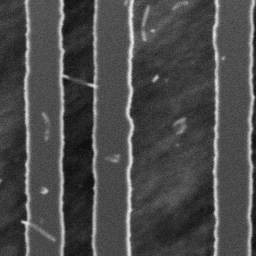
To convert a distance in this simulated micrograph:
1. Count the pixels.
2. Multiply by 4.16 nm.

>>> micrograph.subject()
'lines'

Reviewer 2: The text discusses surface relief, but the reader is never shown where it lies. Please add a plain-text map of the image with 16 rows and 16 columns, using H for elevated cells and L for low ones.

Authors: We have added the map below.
LLHHLLHHLLLLLHHH
LLHHLLHHLLLLLHHH
LLHHLLHHLLLLLHHH
LLHHLLHHLLLLLHHH
LLHHLLHHLLLLLHHH
LLHHLLHHLLLLLHHH
LLHHLLHHLLLLLHHH
LLHHLLHHLLLLLHHH
LLHHLLHHLLLLLHHH
LLHHLLHHLLLLLHHH
LLHHLLHHLLLLLHHH
LLHHLLHHLLLLLHHH
LLHHLLHHLLLLLHHH
LLHHLLHHLLLLLHHH
LLHHLLHHLLLLLHHH
LLHHLLHHLLLLLHHH